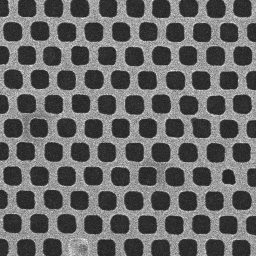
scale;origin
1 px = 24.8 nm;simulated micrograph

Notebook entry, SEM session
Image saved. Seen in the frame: a regular array of holes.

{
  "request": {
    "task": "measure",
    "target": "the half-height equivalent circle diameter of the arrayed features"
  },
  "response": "0.509 microns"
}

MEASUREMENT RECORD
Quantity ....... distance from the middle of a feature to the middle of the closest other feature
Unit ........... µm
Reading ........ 0.663